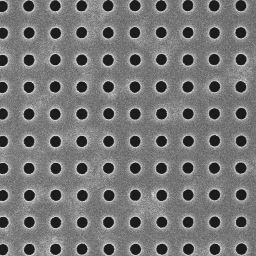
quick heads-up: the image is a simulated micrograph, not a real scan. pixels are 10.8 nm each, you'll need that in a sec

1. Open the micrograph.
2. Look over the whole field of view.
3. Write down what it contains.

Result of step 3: a regular array of holes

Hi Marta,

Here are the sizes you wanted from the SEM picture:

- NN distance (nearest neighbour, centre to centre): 284 nanometers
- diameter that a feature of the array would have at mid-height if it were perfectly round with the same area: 121 nm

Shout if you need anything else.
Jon